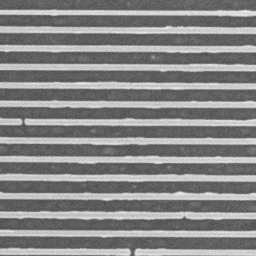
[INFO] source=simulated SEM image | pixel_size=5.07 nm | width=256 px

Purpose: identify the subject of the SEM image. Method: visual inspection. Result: parallel lines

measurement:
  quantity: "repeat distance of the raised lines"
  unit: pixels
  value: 18.4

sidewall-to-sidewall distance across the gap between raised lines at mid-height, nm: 60.8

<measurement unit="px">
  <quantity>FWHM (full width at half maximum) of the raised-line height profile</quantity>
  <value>6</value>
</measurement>